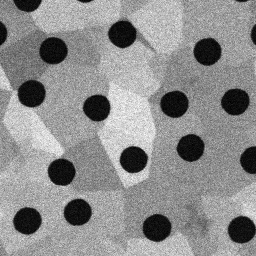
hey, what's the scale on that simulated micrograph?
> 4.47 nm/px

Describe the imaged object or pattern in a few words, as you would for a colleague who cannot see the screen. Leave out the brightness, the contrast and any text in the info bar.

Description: a regular array of holes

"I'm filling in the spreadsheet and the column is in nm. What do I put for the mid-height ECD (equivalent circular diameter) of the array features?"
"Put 124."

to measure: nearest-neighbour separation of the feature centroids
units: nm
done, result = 227